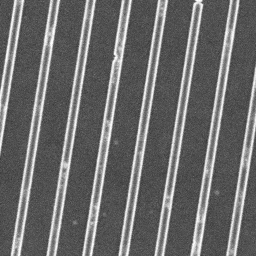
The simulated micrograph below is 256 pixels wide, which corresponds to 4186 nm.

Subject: parallel lines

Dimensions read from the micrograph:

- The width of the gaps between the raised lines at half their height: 454 nm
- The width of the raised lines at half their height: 127 nm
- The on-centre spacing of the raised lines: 581 nm